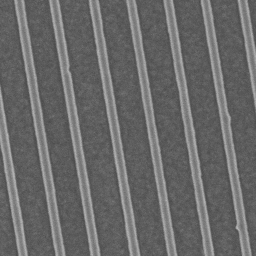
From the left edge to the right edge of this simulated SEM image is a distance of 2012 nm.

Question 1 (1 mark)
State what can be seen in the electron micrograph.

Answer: parallel lines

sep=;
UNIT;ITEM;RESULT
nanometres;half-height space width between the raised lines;226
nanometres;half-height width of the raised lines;67.9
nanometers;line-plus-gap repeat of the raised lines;289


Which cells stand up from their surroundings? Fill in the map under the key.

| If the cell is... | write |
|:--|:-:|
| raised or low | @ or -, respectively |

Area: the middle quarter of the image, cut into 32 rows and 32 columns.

@--------@@-------@@--------@@--
@--------@@--------@@-------@@--
@@-------@@--------@@-------@@--
@@--------@@-------@@-------@@--
@@--------@@-------@@-------@@--
@@--------@@-------@@--------@--
@@--------@@-------@@--------@@-
@@--------@@--------@@-------@@-
@@@-------@@--------@@-------@@-
-@@--------@@-------@@-------@@-
-@@--------@@-------@@-------@@-
-@@--------@@-------@@--------@-
-@@--------@@-------@@--------@@
-@@--------@@-------@@@-------@@
-@@@-------@@--------@--------@@
--@@--------@@-------@@-------@@
--@@--------@@-------@@-------@@
--@@--------@@-------@@-------@@
--@@--------@@-------@@--------@
--@@--------@@-------@@--------@
--@@--------@@--------@@-------@
---@@--------@@-------@@-------@
---@@--------@@-------@@-------@
---@@--------@@-------@@--------
---@@--------@@-------@@--------
---@@--------@@-------@@--------
---@@--------@@--------@@-------
----@@--------@@-------@@-------
----@@--------@@-------@@-------
----@@--------@@-------@@-------
----@@--------@@-------@@-------
----@@--------@@-------@@-------